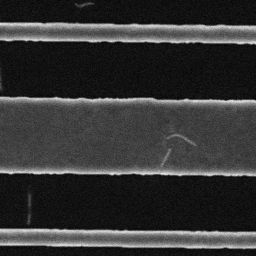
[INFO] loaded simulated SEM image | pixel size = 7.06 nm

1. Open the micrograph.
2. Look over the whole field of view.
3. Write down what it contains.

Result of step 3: lines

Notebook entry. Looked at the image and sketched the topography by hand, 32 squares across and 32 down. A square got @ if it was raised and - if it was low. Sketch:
--------------------------------
--------------------------------
--------------------------------
@@@@@@@@@@@@@@@@@@@@@@@@@@@@@@@@
@@@@@@@@@@@@@@@@@@@@@@@@@@@@@@@@
--------------------------------
--------------------------------
--------------------------------
--------------------------------
--------------------------------
--------------------------------
--------------------------------
@@@@@@@@@@@@@@@@@@@@---@--@-----
@@@@@@@@@@@@@@@@@@@@@@@@@@@@@@@@
@@@@@@@@@@@@@@@@@@@@@@@@@@@@@@@@
@@@@@@@@@@@@@@@@@@@@@@@@@@@@@@@@
@@@@@@@@@@@@@@@@@@@@@@@@@@@@@@@@
@@@@@@@@@@@@@@@@@@@@@@@@@@@@@@@@
@@@@@@@@@@@@@@@@@@@@@@@@@@@@@@@@
@@@@@@@@@@@@@@@@@@@@@@@@@@@@@@@@
@@@@@@@@@@@@@@@@@@@@@@@@@@@@@@@@
@@@@@@@@@@@@@@@@@@@@@@@@@@@@@@@@
--------------------------------
--------------------------------
--------------------------------
--------------------------------
--------------------------------
--------------------------------
--------------------------------
@@@@@@@@@@@@@@@@@@@@@@@@@@@@@@@@
@@@@@@@@@@@@@@@@@@@@@@@@@@@@@@@@
--------------------------------